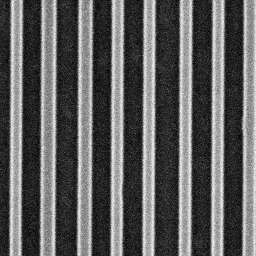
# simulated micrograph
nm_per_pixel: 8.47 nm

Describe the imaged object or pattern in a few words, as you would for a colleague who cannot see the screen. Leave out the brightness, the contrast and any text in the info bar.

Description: parallel lines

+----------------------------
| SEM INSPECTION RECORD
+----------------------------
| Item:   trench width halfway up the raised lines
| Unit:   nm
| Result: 188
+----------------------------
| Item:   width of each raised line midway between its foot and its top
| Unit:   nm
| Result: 85.7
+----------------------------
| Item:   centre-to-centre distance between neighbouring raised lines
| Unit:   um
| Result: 0.284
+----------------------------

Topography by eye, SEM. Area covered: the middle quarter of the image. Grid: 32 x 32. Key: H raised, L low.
LLLLHHHLLLLLHHHLLLLLHHLLLLLLLHHH
LLLLHHHLLLLLHHHLLLLLHHLLLLLLLHHH
LLLLHHHLLLLLHHHLLLLLHHLLLLLLLHHH
LLLLHHHLLLLLHHHLLLLLHHLLLLLLLHHH
LLLLHHHLLLLLHHHLLLLLHHLLLLLLLHHH
LLLLHHHLLLLLHHHLLLLLHHLLLLLLLHHH
LLLLHHHLLLLLHHHLLLLLHHLLLLLLLHHH
LLLLHHHLLLLLHHHLLLLLHHLLLLLLLHHH
LLLLHHHLLLLLHHHLLLLLHHLLLLLLLHHH
LLLLHHHLLLLLHHHLLLLLHHLLLLLLLHHH
LLLLHHHLLLLLHHHLLLLLHHLLLLLLLHHH
LLLLHHHLLLLLHHHLLLLLHHLLLLLLLHHH
LLLLHHHLLLLLHHHLLLLLHHLLLLLLLHHH
LLLLHHHLLLLLHHLLLLLLHHLLLLLLLHHH
LLLLHHHLLLLLHHLLLLLLHHLLLLLLLHHH
LLLLHHHLLLLLHHLLLLLLHHLLLLLLLHHH
LLLLHHHLLLLLHHLLLLLLHHLLLLLLLHHH
LLLLHHHLLLLLHHLLLLLLHHLLLLLLLHHH
LLLLHHHLLLLLHHLLLLLLHHLLLLLLLHHH
LLLLHHHLLLLLHHLLLLLLHHLLLLLLLHHH
LLLLHHHLLLLLHHLLLLLLHHLLLLLLLHHH
LLLLHHHLLLLLHHLLLLLLHHLLLLLLLHHH
LLLLHHHLLLLLHHLLLLLLHHLLLLLLLHHH
LLLLHHHLLLLLHHLLLLLLHHLLLLLLLHHH
LLLLHHHLLLLLHHLLLLLLHHLLLLLLLHHH
LLLLHHHLLLLLHHLLLLLLHHLLLLLLLHHH
LLLLHHHLLLLLHHLLLLLLHHLLLLLLLHHH
LLLLHHHLLLLLHHLLLLLLHHLLLLLLLHHH
LLLLHHHLLLLLHHLLLLLLHHLLLLLLLHHH
LLLLHHHLLLLLHHLLLLLLHHLLLLLLLHHH
LLLLHHHLLLLLHHLLLLLLHHLLLLLLLHHH
LLLLHHHLLLLLHHLLLLLLHHLLLLLLLHHH